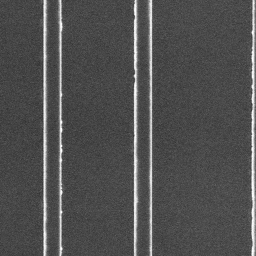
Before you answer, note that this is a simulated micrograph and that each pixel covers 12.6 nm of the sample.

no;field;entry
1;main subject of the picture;lines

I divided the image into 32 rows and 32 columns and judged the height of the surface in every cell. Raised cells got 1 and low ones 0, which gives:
00000011000000000110000000000000
00000011000000000110000000000000
00000011000000000110000000000000
00000011000000000110000000000000
00000011000000000110000000000000
00000011000000000110000000000000
00000011000000000110000000000000
00000011000000000110000000000000
00000011000000000110000000000000
00000011000000000110000000000000
00000011000000000110000000000000
00000011000000000110000000000000
00000011000000000110000000000000
00000011000000000110000000000000
00000011000000000110000000000000
00000011000000000110000000000000
00000011000000000110000000000000
00000011000000000110000000000000
00000011000000000110000000000000
00000011000000000110000000000000
00000011000000000110000000000000
00000011000000000110000000000000
00000011000000000110000000000000
00000011000000000110000000000000
00000011000000000110000000000000
00000011000000000110000000000000
00000011000000000110000000000000
00000011000000000110000000000000
00000011000000000110000000000000
00000011000000000110000000000000
00000011000000000110000000000000
00000011000000000110000000000000